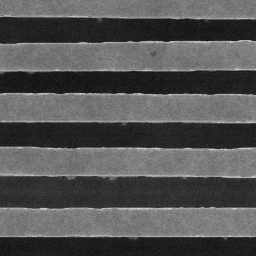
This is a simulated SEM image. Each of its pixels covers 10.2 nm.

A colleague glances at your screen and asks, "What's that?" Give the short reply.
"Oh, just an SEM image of lines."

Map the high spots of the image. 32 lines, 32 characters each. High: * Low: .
********************************
********************************
................................
................................
................................
..******************************
********************************
********************************
********************************
................................
................................
................................
********************************
********************************
********************************
................................
................................
................................
*****.......*...................
********************************
********************************
********************************
................................
................................
................................
................................
********************************
********************************
********************************
********************************
................................
................................